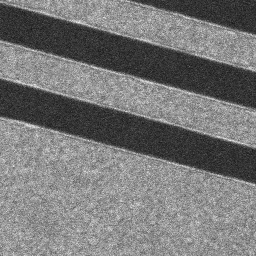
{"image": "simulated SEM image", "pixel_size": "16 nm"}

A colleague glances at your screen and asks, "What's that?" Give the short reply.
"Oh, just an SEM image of one or a few lines or trenches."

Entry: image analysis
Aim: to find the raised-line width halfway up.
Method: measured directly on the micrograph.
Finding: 0.628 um